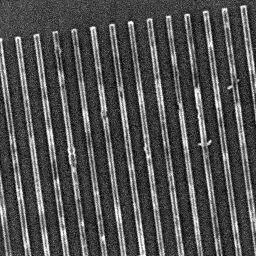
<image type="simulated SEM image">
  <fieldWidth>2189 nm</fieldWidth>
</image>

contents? parallel lines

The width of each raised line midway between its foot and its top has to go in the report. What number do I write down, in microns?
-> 0.0391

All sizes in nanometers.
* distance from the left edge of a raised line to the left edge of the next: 162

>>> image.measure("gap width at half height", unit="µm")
0.126